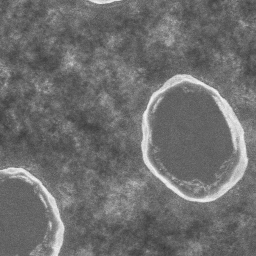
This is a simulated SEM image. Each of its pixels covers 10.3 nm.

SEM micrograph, raised bodies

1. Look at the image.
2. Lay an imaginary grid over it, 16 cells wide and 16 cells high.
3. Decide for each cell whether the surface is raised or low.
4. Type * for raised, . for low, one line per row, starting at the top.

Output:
................
................
................
................
................
..........***...
.........*****..
.........******.
.........******.
.........******.
..........*****.
**.........***..
***.............
****............
****............
****............